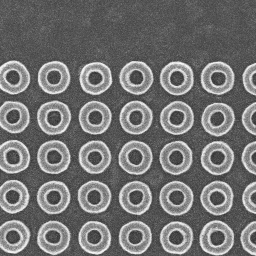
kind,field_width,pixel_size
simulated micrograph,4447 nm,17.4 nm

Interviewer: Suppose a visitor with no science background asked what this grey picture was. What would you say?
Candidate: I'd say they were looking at a regular array of ring-shaped raised bodies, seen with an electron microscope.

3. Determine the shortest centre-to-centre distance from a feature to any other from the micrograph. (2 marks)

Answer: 688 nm